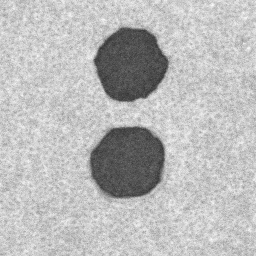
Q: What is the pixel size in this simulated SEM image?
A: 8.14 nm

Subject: holes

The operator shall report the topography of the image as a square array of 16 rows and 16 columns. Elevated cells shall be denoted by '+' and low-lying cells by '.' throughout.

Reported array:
++++++++++++++++
++++++++++++++++
+++++++...++++++
++++++....++++++
++++++....++++++
++++++....++++++
++++++++++++++++
++++++++++++++++
++++++....++++++
++++++....++++++
++++++....++++++
++++++....++++++
++++++++++++++++
++++++++++++++++
++++++++++++++++
++++++++++++++++